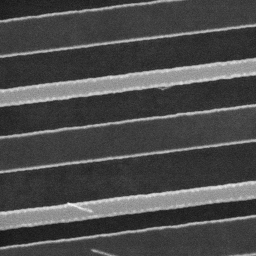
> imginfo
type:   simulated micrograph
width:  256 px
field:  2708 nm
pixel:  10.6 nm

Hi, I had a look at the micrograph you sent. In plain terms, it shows lines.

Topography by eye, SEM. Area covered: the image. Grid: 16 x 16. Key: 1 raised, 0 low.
0000001111111111
1111111111111111
1111111110000000
1000000000000000
0000000000000000
0000000000000000
0000000000000000
0000000011111111
1111111111111111
1111111111100000
1100000000000000
0000000000000000
0000000000000000
0000000000000000
0000000011111111
1111111111111111